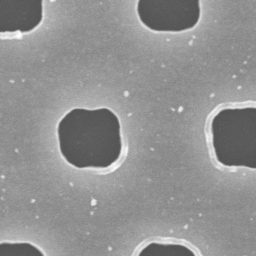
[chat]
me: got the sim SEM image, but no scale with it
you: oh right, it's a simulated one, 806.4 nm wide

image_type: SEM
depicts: holes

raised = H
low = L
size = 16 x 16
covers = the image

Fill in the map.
LLLHHHHHHLLLHHHH
LLHHHHHHHLLLHHHH
HHHHHHHHHHHHHHHH
HHHHHHHHHHHHHHHH
HHHHHHHHHHHHHHHH
HHHHHHHHHHHHHHHH
HHHHHHHHHHHHHHHH
HHHHLLLHHHHHHLLL
HHHHLLLLHHHHHLLL
HHHHLLLLHHHHHLLL
HHHHHHHHHHHHHHHH
HHHHHHHHHHHHHHHH
HHHHHHHHHHHHHHHH
HHHHHHHHHHHHHHHH
HHHHHHHHHHHHHHHH
LLHHHHHHHLLLHHHH